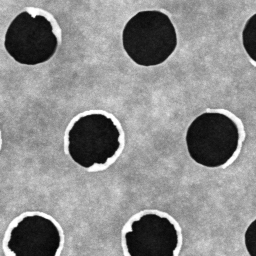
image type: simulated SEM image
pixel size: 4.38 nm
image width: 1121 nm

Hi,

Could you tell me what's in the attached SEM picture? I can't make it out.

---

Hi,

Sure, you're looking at holes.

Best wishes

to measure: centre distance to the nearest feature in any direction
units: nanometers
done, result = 514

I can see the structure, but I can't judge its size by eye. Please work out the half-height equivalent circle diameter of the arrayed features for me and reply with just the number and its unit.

229 nm